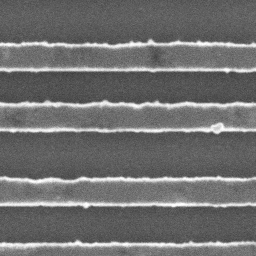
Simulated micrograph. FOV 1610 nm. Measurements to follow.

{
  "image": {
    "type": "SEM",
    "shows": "lines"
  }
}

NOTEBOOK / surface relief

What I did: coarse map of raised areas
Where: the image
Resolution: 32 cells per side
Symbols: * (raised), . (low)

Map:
................................
................................
................................
................................
................................
********..**....**************..
********************************
********************************
********************************
................................
................................
................................
................................
********************************
********************************
********************************
................................
................................
................................
................................
................................
................................
****.***.***********************
********************************
********************************
********************************
................................
................................
................................
................................
**********************.*********
********************************